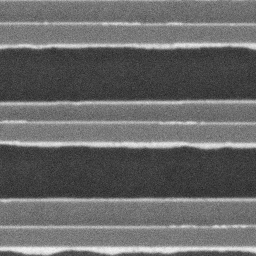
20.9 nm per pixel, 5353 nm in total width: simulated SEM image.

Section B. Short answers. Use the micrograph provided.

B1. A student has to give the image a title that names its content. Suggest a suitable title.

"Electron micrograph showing lines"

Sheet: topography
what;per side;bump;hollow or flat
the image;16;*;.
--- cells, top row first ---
****************
****************
****************
................
................
................
...*************
****************
****************
................
................
................
................
****************
****************
****************